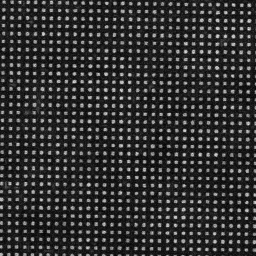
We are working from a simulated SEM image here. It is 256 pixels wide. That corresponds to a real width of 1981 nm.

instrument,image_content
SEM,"a regular array of raised bodies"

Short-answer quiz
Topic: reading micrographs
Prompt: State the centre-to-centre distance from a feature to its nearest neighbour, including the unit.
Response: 56.9 nanometers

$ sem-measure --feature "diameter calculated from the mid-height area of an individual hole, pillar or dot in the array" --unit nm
26.2